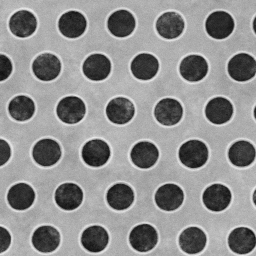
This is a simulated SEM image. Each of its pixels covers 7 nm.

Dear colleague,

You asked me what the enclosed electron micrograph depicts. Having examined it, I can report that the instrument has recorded a regular array of holes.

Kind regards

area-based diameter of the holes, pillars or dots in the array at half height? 28.7 pixels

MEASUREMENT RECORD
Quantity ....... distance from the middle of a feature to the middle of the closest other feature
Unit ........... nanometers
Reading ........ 338